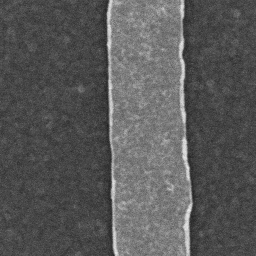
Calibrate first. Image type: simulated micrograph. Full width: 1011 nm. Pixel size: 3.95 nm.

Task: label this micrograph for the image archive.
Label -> one or a few lines or trenches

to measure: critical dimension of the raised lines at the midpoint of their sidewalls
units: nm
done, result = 300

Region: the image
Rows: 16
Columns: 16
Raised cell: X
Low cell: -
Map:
-------XXXX-----
-------XXXX-----
-------XXXX-----
-------XXXX-----
-------XXXX-----
-------XXXX-----
-------XXXX-----
-------XXXXX----
-------XXXXX----
-------XXXXX----
-------XXXXX----
-------XXXXX----
-------XXXXX----
-------XXXXX----
-------XXXXX----
-------XXXXX----